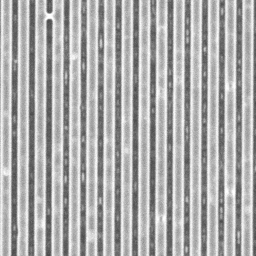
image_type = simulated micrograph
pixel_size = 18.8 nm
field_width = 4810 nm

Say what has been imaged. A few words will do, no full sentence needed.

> parallel lines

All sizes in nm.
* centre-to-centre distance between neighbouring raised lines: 324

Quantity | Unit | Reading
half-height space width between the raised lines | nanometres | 136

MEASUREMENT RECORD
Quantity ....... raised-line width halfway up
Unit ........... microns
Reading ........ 0.188